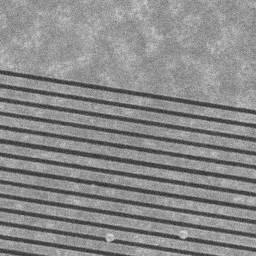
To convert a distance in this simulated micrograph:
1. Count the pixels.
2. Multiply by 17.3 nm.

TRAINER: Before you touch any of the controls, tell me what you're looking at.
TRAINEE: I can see parallel lines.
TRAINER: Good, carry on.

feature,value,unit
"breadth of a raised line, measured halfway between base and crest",0.15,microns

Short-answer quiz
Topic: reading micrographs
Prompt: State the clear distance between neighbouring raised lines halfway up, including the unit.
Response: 83.4 nanometres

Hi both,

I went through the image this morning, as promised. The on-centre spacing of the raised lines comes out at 235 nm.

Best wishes